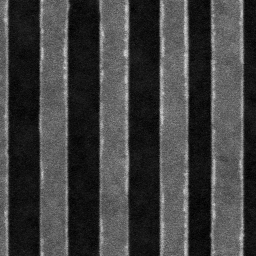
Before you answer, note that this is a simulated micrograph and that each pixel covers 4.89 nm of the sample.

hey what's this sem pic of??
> parallel lines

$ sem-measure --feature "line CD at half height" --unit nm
134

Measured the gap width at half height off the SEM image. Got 0.161 um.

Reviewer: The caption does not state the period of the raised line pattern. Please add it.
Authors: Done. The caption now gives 282 nm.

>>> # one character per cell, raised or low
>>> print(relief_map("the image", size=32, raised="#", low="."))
#....###.....###....###...####..
#....###.....###....###...####..
#....###.....###....###...####..
#....###.....###....###...####..
#....###.....###....###...####..
#....###.....###....###...####..
#....###.....###....###....###..
#....###.....###....###...####..
#....###.....###....###....###..
#....###.....###....###....###..
#....###.....###....###....###..
#....###.....###....###....###..
#....###.....###....###...####..
#....###.....###....###....###..
#....###.....###....###....###..
#....###.....###....###....###..
#....###.....###....###....###..
#....###.....###....###....###..
#....###.....###....###....###..
#....###.....###....###....###..
#....###.....###....###....###..
#....###.....###....###....###..
#....###.....###....###...####..
#....###.....###....###...####..
#....###.....###....###...####..
#....###.....###....###....###..
#....###.....###....###...####..
#....###.....###....###...####..
#....###.....###....###...####..
#....###.....###....###...####..
#....###.....###....###...####..
#....###.....###....###...####..